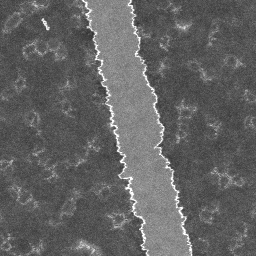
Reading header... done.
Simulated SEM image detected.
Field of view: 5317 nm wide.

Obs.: one or a few lines or trenches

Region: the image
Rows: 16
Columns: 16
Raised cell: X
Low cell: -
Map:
XXXXX---XXXXXXXX
XXXXXX--XXXXXXXX
XXXXXX---XXXXXXX
XXXXXX---XXXXXXX
XXXXXX---XXXXXXX
XXXXXXX--XXXXXXX
XXXXXXX---XXXXXX
XXXXXXX---XXXXXX
XXXXXXX---XXXXXX
XXXXXXXX--XXXXXX
XXXXXXXX---XXXXX
XXXXXXXX---XXXXX
XXXXXXXX---XXXXX
XXXXXXXXX--XXXXX
XXXXXXXXX---XXXX
XXXXXXXXX---XXXX